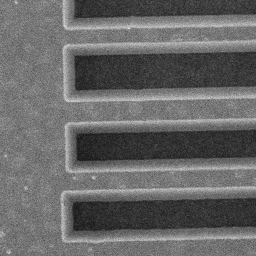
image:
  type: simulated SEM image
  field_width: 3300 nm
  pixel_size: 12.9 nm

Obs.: one or a few lines or trenches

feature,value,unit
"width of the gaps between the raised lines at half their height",522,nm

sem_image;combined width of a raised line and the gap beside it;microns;0.931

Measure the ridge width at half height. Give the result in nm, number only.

367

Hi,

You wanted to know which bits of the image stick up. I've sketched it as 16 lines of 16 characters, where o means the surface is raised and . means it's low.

oooo............
oooooooooooooooo
oooooooooooooooo
oooo............
oooo............
oooo............
oooooooooooooooo
oooooooooooooooo
oooo............
oooo............
oooooooooooooooo
oooooooooooooooo
oooo............
oooo............
oooo............
oooooooooooooooo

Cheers